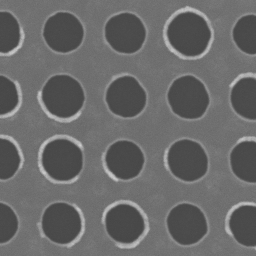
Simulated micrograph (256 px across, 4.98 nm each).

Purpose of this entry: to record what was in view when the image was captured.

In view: a regular array of holes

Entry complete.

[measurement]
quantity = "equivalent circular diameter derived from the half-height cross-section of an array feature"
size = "206 nm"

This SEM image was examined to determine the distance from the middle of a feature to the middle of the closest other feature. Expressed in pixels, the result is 62.4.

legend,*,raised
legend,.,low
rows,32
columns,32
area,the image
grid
********************************
.*******************************
..****....****....****....****..
..***.....***.....***.....***...
...**.....***.....***.....***...
..****....****....***.....***...
.******..******..*****...*****..
********************************
********************************
*******..******.*******.********
..****....****...****....****...
..***.....***.....***.....***...
..***......**.....***.....***...
..****....****....***.....***...
*******..******..*****...*****..
********************************
********************************
.******..**************.********
..****....****...****....****...
..***.....***.....***.....***...
..***.....***.....***.....***...
..****....****...****.....***...
*******..**************..*****..
********************************
********************************
.******..******.*******.********
..****....***....****....****...
..***.....***.....***.....***...
..***.....***.....***.....***...
..****....****....***.....***...
***********************.******..
********************************